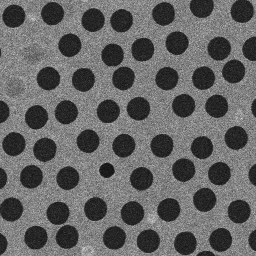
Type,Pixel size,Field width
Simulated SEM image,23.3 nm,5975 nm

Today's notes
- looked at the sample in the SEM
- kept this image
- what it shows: a regular array of holes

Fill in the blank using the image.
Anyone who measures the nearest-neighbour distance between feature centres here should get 728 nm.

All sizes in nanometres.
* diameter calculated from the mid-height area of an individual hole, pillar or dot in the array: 548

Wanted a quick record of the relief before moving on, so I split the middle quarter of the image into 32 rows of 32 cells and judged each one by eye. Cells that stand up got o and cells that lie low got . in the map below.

ooooooooooo..ooooooooooooooooooo
ooo....oooooo....ooooooo....oooo
oo......oooo......ooooo.....oooo
oo......oooo......ooooo......ooo
oo......oooo.....oooooo......ooo
oo.....oooooo....oooooo.....oooo
ooo...oooooooo.oooooooooo..ooooo
ooooooooooooooooooooooooooooo..o
oooooooooooooooooo..oooooooo....
..ooooooo....ooo.....oooooo.....
...oooooo.....oo......ooooo.....
...ooooo......oo......ooooo.....
...ooooo......oo.....ooooooo....
...oooooo....oooo...oooooooooooo
..ooooooo....ooooooooooooooooooo
oooooooooooooooooooooooooooooooo
ooooo..ooooooooooooooooooooooooo
oooo....oooooooooooooooo.ooooooo
ooo......oooo....ooooo.....ooooo
ooo......ooo......oooo.....ooooo
ooo......ooo......ooo......ooooo
oooo....oooo......oooo.....ooooo
ooooooooooooo....ooooo.....ooooo
oooooooooooooooooooooooo.oooo.oo
oooooooooooooooooooooooooooo....
ooooooooo...ooooooooooooooo.....
...oooooo....oooo....oooooo.....
....ooooo...ooooo.....ooooo.....
....oooooo.ooooo......oooooo....
....ooooooooooooo.....ooooooo.oo
...oooooooooooooo.....oooooooooo
.oooooooooooooooooo.oooooooooooo